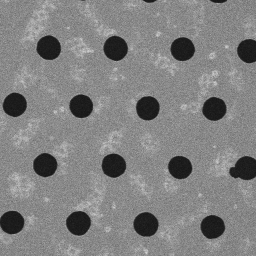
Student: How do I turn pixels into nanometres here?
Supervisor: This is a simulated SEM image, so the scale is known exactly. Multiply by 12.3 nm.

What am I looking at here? a regular array of holes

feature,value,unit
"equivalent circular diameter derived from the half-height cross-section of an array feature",0.294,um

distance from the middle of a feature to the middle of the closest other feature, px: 66.6